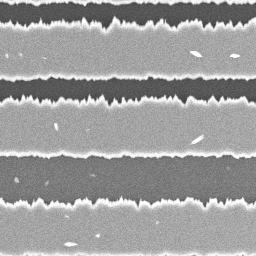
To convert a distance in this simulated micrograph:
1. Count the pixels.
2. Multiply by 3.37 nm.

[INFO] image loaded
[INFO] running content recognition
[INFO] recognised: lines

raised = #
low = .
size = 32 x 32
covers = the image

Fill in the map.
.#..##....#...##.....#..#.......
................................
..........#...#................#
################################
################################
################################
################################
################################
################################
################################
................................
................................
######.##..##...#########.#####.
################################
################################
################################
################################
################################
################################
..#..##..##..##.####.##..#.#.###
................................
................................
................................
................................
................................
#########################.######
################################
################################
################################
################################
################################
################################